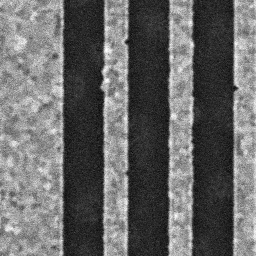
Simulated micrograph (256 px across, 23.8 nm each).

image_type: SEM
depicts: one or a few lines or trenches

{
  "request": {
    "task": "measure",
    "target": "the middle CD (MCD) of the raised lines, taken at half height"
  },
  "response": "495 nm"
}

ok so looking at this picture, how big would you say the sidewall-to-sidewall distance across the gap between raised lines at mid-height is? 1040 nm